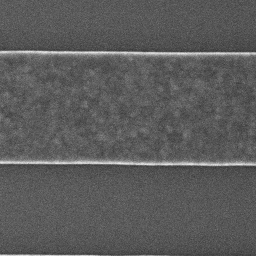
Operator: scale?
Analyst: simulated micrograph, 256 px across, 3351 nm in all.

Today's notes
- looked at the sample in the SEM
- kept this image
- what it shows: wiring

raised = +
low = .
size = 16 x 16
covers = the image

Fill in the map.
................
................
................
++++++++++++++++
++++++++++++++++
++++++++++++++++
++++++++++++++++
++++++++++++++++
++++++++++++++++
++++++++++++++++
................
................
................
................
................
................